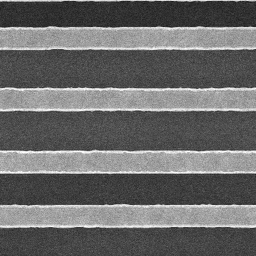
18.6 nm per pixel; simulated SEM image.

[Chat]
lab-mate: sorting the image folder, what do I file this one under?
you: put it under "lines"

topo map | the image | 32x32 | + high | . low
................................
................................
................................
++++++++++++++++++++++++++++++++
++++++++++++++++++++++++++++++++
++++++++++++++++++++++++++++++++
................................
................................
................................
................................
................................
++++++++++++++++++++++++++++++++
++++++++++++++++++++++++++++++++
++++++++++++++++++++++++++++++++
................................
................................
................................
................................
................................
++++++++++++++++++++++++++++++++
++++++++++++++++++++++++++++++++
++++++++++++++++++++++++++++++++
................................
................................
................................
................................
++++++++++++++++++++++++++++++++
++++++++++++++++++++++++++++++++
................................
................................
................................
................................